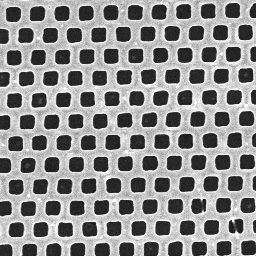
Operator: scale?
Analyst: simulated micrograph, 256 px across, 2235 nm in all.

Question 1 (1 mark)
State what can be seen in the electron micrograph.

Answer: a regular array of holes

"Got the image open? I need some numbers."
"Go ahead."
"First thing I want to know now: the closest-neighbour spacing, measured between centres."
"210 nm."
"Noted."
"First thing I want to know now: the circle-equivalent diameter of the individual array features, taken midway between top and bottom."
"16.3 px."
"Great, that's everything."